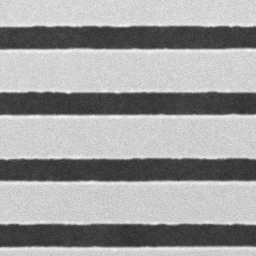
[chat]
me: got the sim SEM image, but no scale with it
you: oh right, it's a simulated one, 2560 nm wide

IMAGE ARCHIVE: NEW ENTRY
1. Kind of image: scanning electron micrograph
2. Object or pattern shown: lines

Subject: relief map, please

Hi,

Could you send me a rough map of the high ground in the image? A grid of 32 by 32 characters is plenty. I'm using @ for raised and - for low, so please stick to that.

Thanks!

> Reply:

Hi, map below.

@@@@@@@@@@@@@@@@@@@@@@@@@@@@@@@@
@@@@@@@@@@@@@@@@@@@@@@@@@@@@@@@@
@@@@@@@@@@@@@@@@@@@@@@@@@@@@@@@@
--------------------------------
--------------------------------
--------------------------------
@@@@@@@@@@@@@@@@@@@@@@@@@@@@@@@@
@@@@@@@@@@@@@@@@@@@@@@@@@@@@@@@@
@@@@@@@@@@@@@@@@@@@@@@@@@@@@@@@@
@@@@@@@@@@@@@@@@@@@@@@@@@@@@@@@@
@@@@@@@@@@@@@@@@@@@@@@@@@@@@@@@@
--------@-----@-----------------
--------------------------------
--------------------------------
@@@@@@@@@@@@@@@@@@@@@@@@@@@@@@@@
@@@@@@@@@@@@@@@@@@@@@@@@@@@@@@@@
@@@@@@@@@@@@@@@@@@@@@@@@@@@@@@@@
@@@@@@@@@@@@@@@@@@@@@@@@@@@@@@@@
@@@@@@@@@@@@@@@@@@@@@@@@@@@@@@@@
@@@@@@@@@@@@@@@@@@@@@@@@@@@@@@@@
--------------------------------
--------------------------------
--------------------------------
@@@@@@@@@@@@@@@@@@@@@@@@@@@@@@@@
@@@@@@@@@@@@@@@@@@@@@@@@@@@@@@@@
@@@@@@@@@@@@@@@@@@@@@@@@@@@@@@@@
@@@@@@@@@@@@@@@@@@@@@@@@@@@@@@@@
@@@@@@@@@@@@@@@@@@@@@@@@@@@@@@@@
--------------------------------
--------------------------------
--------------------------------
@@@@@@@@@@@@@@@@@@@@@@@@@@@@@@@@